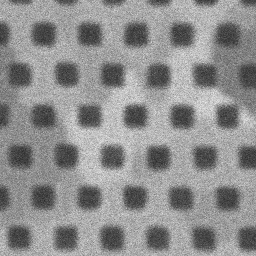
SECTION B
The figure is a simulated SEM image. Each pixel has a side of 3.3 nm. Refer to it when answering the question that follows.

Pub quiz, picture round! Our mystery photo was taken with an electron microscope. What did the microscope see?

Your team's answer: a regular array of holes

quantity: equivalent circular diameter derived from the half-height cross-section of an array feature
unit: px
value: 29.2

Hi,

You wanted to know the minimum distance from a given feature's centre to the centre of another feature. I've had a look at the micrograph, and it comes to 45.9 px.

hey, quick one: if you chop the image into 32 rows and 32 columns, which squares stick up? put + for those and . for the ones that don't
+...+++...+++...++...+++...+++..
++++++++++++++++++++++++++++++++
++++++++++++++++++++++++++++++++
.+++...+++...++....++...+++...++
.+++...+++...++....++...+++...++
.+++...+++...++....++...+++...++
++++++++++++++++++++++++++++++++
++++++++++++++++++++++++++++++++
+...+++...++....++...+++...+++..
+...+++...++....++....++...+++..
+...+++...+++...++...+++...+++..
++++++++++++++++++++++++++++++++
++++++++++++++++++++++++++++++++
.+++...+++...++....++...+++...++
.+++...++....++....++...+++...++
.+++...+++...++....++...+++...++
++++++++++++++++++++++++++++++++
++++++++++++++++++++++++++++++++
+...+++...++....++...+++...+++..
+...+++...++....++....++...+++..
+...+++...++....++....++...+++..
++++++++++++++++++++++++++++++++
++++++++++++++++++++++++++++++++
.+++...+++...++...+++...+++...++
.+++...++....++....++...+++...++
.+++...++....++...+++...+++...++
++++++++++++++++++++++.+++++.+++
++++++++++++++++++++++++++++++++
+...+++...+++..+++...+++...+++..
+...+++...++....++...+++...+++..
+...++....++....++...+++...+++..
+++++++++++++..++++..++++..+++..